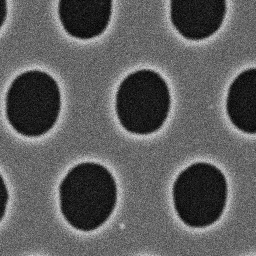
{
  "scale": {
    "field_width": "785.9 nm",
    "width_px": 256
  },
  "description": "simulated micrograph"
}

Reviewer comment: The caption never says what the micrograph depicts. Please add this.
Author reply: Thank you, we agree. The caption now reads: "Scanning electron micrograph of holes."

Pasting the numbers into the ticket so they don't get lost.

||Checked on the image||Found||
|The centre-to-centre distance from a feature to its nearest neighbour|108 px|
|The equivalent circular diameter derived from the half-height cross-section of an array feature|186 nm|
